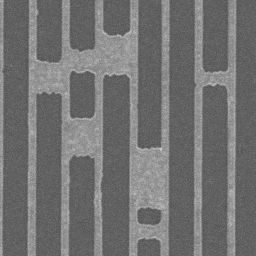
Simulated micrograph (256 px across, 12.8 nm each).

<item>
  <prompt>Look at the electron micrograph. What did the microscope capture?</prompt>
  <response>parallel lines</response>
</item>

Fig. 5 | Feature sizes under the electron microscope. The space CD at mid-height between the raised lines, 334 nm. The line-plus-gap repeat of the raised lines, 426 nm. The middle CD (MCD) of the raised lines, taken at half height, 6.75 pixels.